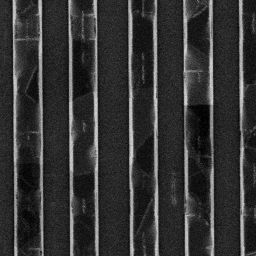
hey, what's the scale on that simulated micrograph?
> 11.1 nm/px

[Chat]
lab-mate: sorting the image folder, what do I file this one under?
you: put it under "wiring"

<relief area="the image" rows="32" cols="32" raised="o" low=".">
..ooo....ooo....ooo....ooo....oo
..ooo....ooo....ooo....ooo....oo
..ooo....oo.....ooo....ooo....oo
..ooo....oo.....ooo....ooo....oo
..ooo....ooo....ooo....ooo....oo
..ooo....ooo....ooo....ooo....oo
..ooo....ooo....ooo....ooo....oo
..ooo....ooo....ooo....ooo....oo
..ooo....ooo....ooo....ooo....oo
..ooo....ooo....ooo.....oo....oo
..ooo....ooo....ooo....ooo....oo
..ooo....ooo....ooo....ooo....oo
..ooo....ooo....ooo....ooo....oo
..ooo....ooo....ooo....ooo....oo
..ooo....ooo....ooo....ooo....oo
..ooo....ooo....ooo....ooo....oo
..ooo....ooo....ooo....ooo....oo
..ooo....ooo.....oo.....oo....oo
..ooo....ooo.....oo....ooo....oo
..ooo....ooo....ooo....ooo....oo
..ooo....ooo....ooo....ooo....oo
..ooo....ooo....ooo....ooo....oo
..ooo....ooo....ooo....ooo....oo
..ooo....ooo.....oo....ooo....oo
..ooo....ooo.....oo....ooo....oo
..ooo....ooo.....oo.....oo....oo
..ooo....ooo.....oo.....oo....oo
..ooo....ooo.....ooo...ooo....oo
..ooo....ooo.....ooo...ooo....oo
..ooo....ooo.....ooo...ooo....oo
..ooo....ooo.....ooo...ooo....oo
..ooo....ooo.....ooo...ooo....oo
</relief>